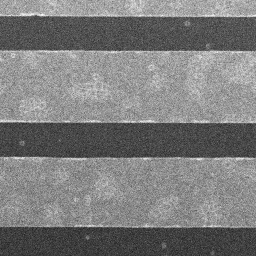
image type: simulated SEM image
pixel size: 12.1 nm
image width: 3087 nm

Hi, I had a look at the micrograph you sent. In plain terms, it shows one or a few lines or trenches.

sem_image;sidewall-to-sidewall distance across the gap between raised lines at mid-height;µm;0.427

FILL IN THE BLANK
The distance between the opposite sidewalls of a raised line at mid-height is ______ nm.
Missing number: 837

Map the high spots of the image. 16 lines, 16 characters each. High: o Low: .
oooooooooooooooo
................
................
oooooooooooooooo
oooooooooooooooo
oooooooooooooooo
oooooooooooooooo
oooooooooooooooo
................
................
oooooooooooooooo
oooooooooooooooo
oooooooooooooooo
oooooooooooooooo
................
................